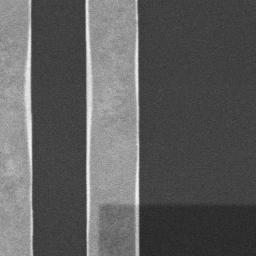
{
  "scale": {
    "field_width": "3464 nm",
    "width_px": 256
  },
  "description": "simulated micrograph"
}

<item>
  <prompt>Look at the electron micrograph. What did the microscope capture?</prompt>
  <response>wiring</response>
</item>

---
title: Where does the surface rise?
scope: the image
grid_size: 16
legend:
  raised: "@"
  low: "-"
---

@@---@@@@-------
@@---@@@@-------
@@---@@@@-------
@@----@@@-------
@@----@@@-------
@@----@@@-------
@@----@@@-------
@@----@@@-------
@@----@@@-------
@@----@@@-------
@@---@@@@-------
@@---@@@@-------
@@----@@@-------
@@---@@@@-------
@@---@@@@-------
@@---@@@@-------